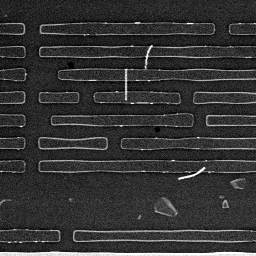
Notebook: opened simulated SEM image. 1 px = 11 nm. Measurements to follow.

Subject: groups of lines, slits or small figures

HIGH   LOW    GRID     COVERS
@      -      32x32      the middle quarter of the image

--------------------------------
--@@@@@@@@@@@@@@@@@------------@
@@@@@@@@@@@@@@@@@@@@@@@@@@@@@@@@
@@@@@@@@@@@@@@@@@@@@@@@@@@@@@@@@
---------------@----------------
--------------------------------
--------------------------------
@@@-----@@@@@@@@@@@@@@@@@@@@----
@@@@----@@@@@@@@@@@@@@@@@@@@@---
@@@-----@@@@@@@@@@@@@@@@@@@@@---
--------------------------------
--------------------------------
--------------------------------
@@@@@@@@@@@@@@@@@@@@@@@@@@@@@@@@
@@@@@@@@@@@@@@@@@@@@@@@@@@@@@@@@
------------------------------@@
--------------------------------
--------------------------------
--------------------------------
@@@@@@@@@@@---@@@@@@@@@@@@@@@@@@
@@@@@@@@@@@---@@@@@@@@@@@@@@@@@@
--------------------------------
--------------------------------
--------------------------------
@@@@@@@@@@@@@@@@@@@@@@@@@@@@@@@@
@@@@@@@@@@@@@@@@@@@@@@@@@@@@@@@@
@@@@@@@@@@@@@@@@@@@@@@@@@@@@@@@@
--------------------------------
--------------------------------
--------------------------------
--------------------------------
--------------------------------